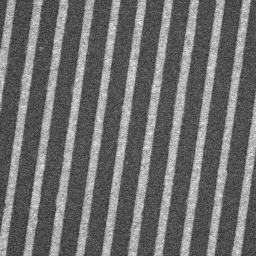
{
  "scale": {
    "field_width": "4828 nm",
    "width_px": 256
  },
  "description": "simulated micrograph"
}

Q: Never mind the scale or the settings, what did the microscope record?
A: parallel lines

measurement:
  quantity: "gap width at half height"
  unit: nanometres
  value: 336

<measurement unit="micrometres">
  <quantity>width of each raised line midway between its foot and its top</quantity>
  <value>0.154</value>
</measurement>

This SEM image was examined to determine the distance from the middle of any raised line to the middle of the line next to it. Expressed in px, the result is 25.8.